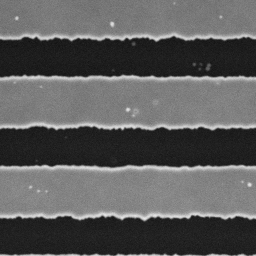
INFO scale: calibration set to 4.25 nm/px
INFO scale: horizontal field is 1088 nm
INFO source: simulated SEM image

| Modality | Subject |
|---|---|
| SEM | lines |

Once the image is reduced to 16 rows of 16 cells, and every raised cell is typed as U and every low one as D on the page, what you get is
UUUUUUUUUUUUUUUU
UUUUUUUUUUUUUUUU
DDDDDDDDDDDDDDDD
DDDDDDDDDDDDDDDD
DDDDDDDDDDDDDDDD
UUUUUUUUUUUUUUUU
UUUUUUUUUUUUUUUU
UUUUUUUUUUUUUUUU
DDDDDDDDDDDDDDDD
DDDDDDDDDDDDDDDD
UUUUUUUUUUUUUUUU
UUUUUUUUUUUUUUUU
UUUUUUUUUUUUUUUU
UUUUUUUUUUUUDUUU
DDDDDDDDDDDDDDDD
DDDDDDDDDDDDDDDD